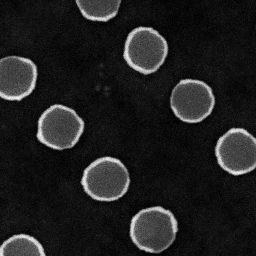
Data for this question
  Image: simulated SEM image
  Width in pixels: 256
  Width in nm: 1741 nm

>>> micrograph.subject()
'raised bodies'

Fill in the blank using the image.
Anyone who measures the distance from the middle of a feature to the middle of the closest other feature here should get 69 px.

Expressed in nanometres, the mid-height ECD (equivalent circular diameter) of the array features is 305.